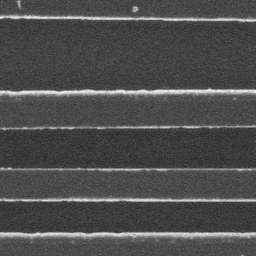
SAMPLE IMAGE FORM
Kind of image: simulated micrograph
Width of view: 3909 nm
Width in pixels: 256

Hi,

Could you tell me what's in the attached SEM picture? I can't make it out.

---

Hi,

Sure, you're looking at lines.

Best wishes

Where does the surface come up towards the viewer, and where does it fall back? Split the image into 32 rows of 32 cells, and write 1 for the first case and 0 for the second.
11111111111111111111111111111111
11111111111111111111111111111111
00000000000000000000000000000011
00000000000000000000000000000000
00000000000000000000000000000000
00000000000000000000000000000000
00000000000000000000000000000000
00000000000000000000000000000000
00000000000000000000000000000000
00000000000000000000000000000000
00000000000000000000000000000000
10011100111111111111111111111111
11111111111111111111111111111111
11111111111111111111111111111111
11111111111111111111111111111111
11111111111111111111111111111111
00000000000000000000000000000000
00000000000000000000000000000000
00000000000000000000000000000000
00000000000000000000000000000000
00000000000000000000000000000000
11111111111111111111111111111111
11111111111111111111111111111111
11111111111111111111111111111111
11111111111111111111111111111111
00000000000000000000000000000000
00000000000000000000000000000000
00000000000000000000000000000000
00000000000000000000000000000000
11111111111111111111111111111111
11111111111111111111111111111111
11111111111111111111111111111111